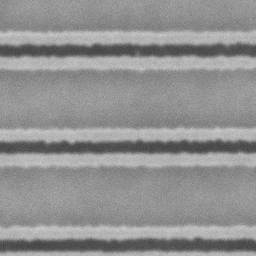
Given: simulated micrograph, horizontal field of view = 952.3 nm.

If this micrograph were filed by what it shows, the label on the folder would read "lines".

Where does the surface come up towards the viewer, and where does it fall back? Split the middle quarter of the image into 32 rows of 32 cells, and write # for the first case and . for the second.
################################
...................#............
................................
................................
................................
................................
................................
................................
................................
................................
................................
................................
................................
................................
................................
................................
##.#.#.###########.########.####
################################
################################
.##....##................#......
................................
................................
###.###...###########..####..##.
################################
################################
.###...#.......#.#...####.......
................................
................................
................................
................................
................................
................................